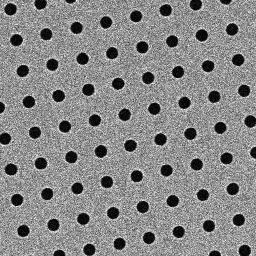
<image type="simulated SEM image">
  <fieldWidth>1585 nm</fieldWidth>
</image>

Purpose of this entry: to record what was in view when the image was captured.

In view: a regular array of holes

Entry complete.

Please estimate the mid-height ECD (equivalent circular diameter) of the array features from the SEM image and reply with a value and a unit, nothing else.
74.1 nm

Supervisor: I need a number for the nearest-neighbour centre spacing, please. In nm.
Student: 188